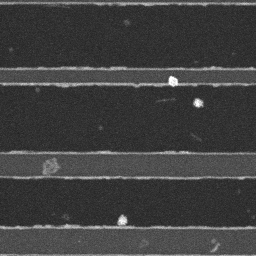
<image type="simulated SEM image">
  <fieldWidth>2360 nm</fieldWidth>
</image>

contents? one or a few lines or trenches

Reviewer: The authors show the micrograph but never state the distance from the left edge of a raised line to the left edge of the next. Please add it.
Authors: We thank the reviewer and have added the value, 83.3 px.